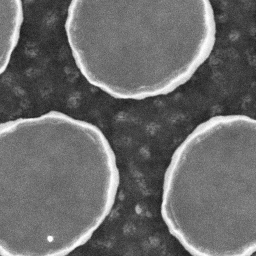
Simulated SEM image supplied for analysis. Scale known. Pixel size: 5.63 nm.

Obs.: raised bodies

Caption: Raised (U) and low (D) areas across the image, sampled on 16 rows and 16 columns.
UDDDUUUUUUUUUDDD
UDDDUUUUUUUUUDDD
UDDDUUUUUUUUUDDD
UDDDDUUUUUUUUDDD
DDDDDUUUUUUUDDDD
DDDDDDUUUUUDDDDD
DDDDDDDDDDDDDDDD
DDUUUDDDDDDDDUUU
UUUUUUDDDDDDUUUU
UUUUUUUDDDDUUUUU
UUUUUUUDDDDUUUUU
UUUUUUUDDDUUUUUU
UUUUUUUDDDUUUUUU
UUUUUUUDDDUUUUUU
UUUUUUDDDDDUUUUU
UUUUUDDDDDDDUUUU